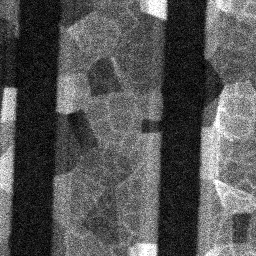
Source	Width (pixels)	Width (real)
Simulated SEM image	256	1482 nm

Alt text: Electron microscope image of one or a few lines or trenches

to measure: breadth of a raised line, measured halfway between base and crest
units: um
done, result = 0.53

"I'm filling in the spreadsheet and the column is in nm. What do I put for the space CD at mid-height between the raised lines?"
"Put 319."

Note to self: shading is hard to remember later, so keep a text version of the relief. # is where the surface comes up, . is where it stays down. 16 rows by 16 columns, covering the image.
#...######...###
#...######...###
#...######...###
#...######...###
#...######...###
#...######...###
#...######...###
....######...###
....######...###
....######...###
....######...###
....######...###
....#####....###
....#####....###
....#####....###
....#####....###